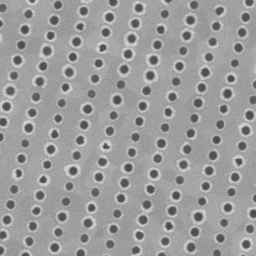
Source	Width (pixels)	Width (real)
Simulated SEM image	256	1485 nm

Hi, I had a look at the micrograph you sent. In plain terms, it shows a regular array of holes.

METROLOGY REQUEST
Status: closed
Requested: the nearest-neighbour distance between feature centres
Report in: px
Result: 15.6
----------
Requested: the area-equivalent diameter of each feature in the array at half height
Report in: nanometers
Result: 51.5